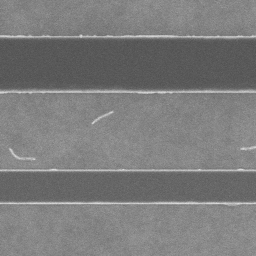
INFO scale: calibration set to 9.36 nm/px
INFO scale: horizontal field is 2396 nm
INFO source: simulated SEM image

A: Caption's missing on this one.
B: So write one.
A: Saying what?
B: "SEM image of lines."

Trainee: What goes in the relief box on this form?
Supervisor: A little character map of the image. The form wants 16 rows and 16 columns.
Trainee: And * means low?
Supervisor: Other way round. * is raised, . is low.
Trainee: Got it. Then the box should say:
................
................
****************
****************
****************
****************
................
................
................
................
................
****************
****************
................
................
................